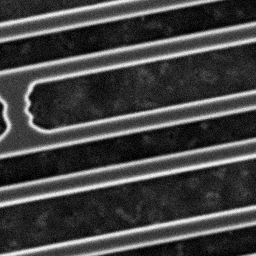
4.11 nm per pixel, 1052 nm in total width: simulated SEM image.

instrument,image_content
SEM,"parallel lines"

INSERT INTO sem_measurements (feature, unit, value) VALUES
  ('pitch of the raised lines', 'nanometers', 238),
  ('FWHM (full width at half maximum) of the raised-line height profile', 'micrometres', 0.0695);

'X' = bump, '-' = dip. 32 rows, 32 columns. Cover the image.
-------------XXXXXXXXXXX--------
--------XXXXXXXXXXX-------------
---XXXXXXXXXXX------------------
XXXXXXXX---------------------XXX
XXX---------------------XXXXXXXX
------------------XXXXXXXXXXX---
-------------XXXXXXXXXXX--------
--------XXXXXXXXXXX-------------
---XXXXXXXXXXX------------------
XXXXXXXXX-----------------------
XXXX----------------------------
XXXX---------------------------X
XXXX----------------------XXXXXX
-XXX-----------------XXXXXXXXXXX
-XXX------------XXXXXXXXXXX-----
-XXX-------XXXXXXXXXXX----------
-XXXXXXXXXXXXXXXX---------------
XXXXXXXXXXX--------------------X
XXXXXX--------------------XXXXXX
X--------------------XXXXXXXXXXX
----------------XXXXXXXXXXX-----
-----------XXXXXXXXXXX----------
-----XXXXXXXXXXXX---------------
XXXXXXXXXXX---------------------
XXXXXX--------------------------
X-------------------------------
----------------------------XXXX
------------------------XXXXXXXX
------------------XXXXXXXXXXX---
-------------XXXXXXXXXXX--------
--------XXXXXXXXXXX-------------
--XXXXXXXXXXXX------------------